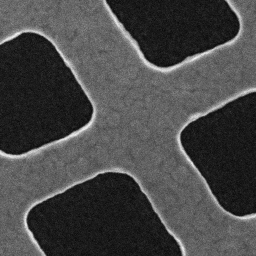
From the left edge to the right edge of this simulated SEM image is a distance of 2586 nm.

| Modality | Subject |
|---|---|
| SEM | holes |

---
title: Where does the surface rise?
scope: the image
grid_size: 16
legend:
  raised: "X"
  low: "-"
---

XXXXXXX-------XX
XXXXXXXX-------X
X--XXXXX------XX
----XXXXX---XXXX
----XXXXXXXXXXXX
-----XXXXXXXXXXX
------XXXXXXXX--
------XXXXXX----
----XXXXXXX-----
--XXXXXXXXXX----
XXXXXXXXXXXX----
XXXXX----XXXX---
XXX------XXXXX--
XX--------XXXXXX
XX---------XXXXX
XXX--------XXXXX